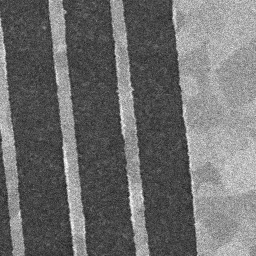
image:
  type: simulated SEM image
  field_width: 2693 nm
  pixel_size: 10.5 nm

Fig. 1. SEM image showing one or a few lines or trenches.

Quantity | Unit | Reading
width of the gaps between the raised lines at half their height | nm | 517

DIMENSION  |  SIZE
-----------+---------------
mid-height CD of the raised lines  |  134 nm